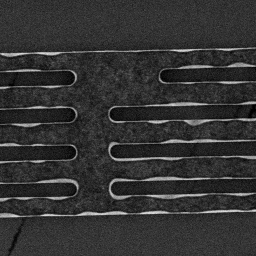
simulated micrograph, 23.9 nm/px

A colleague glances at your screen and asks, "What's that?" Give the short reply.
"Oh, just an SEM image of groups of lines, slits or small figures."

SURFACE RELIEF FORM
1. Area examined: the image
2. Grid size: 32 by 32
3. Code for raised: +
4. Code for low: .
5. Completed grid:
................................
................................
................................
................................
................................
................................
...........+++++++++++++++++++++
++++++++++++++++++++++++++++++++
+++++++++++++++++++++++.........
.........+++++++++++............
.........+++++++++++++++++++++++
++++++++++++++++++++++++++++++++
++++++++++++++++++++++++++++++++
++++....++++++..................
.........+++++..................
.....+++++++++++++++++++++++++++
++++++++++++++++++++++++++++++++
++++++++++++++++++++++++++++++..
.........+++++..................
.........+++++..................
++++++++++++++++++++++++++++++++
++++++++++++++++++++++++++++++++
++++++++++++++...+..............
..........++++..................
.........+++++..+++...++++++++++
++++++++++++++++++++++++++++++++
++++++++++++++++++++++++++......
................................
................................
................................
................................
................................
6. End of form